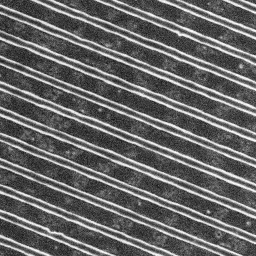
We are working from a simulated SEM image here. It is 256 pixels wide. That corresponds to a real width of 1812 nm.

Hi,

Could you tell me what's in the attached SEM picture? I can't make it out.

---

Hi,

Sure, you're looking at parallel lines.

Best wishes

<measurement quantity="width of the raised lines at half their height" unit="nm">50.1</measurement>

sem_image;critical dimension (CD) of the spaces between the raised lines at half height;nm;118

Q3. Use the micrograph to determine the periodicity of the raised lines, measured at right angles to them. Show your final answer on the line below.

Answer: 23.8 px